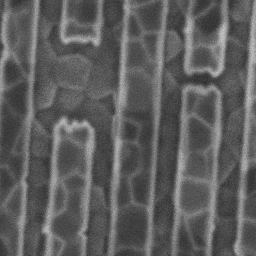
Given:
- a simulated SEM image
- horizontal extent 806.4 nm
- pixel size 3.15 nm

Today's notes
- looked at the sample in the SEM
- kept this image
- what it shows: one or a few lines or trenches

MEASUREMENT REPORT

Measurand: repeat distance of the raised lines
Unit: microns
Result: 0.198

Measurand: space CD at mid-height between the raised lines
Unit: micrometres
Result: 0.0813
